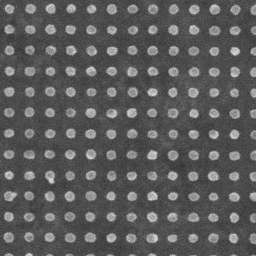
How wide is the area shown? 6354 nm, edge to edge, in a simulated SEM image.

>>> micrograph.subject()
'a regular array of raised bodies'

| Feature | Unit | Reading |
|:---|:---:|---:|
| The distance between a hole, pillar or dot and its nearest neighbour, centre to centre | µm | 0.501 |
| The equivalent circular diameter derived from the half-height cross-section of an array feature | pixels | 8.67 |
